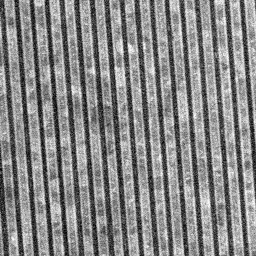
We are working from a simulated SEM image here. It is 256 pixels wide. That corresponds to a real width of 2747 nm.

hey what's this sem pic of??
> parallel lines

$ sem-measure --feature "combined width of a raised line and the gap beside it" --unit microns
0.161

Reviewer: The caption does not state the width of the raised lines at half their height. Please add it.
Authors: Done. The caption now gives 8.23 px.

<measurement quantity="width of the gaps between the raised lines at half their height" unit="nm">69.5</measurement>